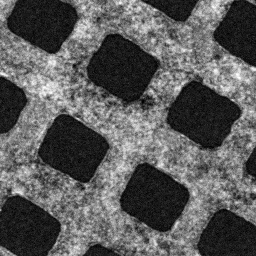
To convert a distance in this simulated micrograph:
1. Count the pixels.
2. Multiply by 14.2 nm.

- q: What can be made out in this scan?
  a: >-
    raised bodies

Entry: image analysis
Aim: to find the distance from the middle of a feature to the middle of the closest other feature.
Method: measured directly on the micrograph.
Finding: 1340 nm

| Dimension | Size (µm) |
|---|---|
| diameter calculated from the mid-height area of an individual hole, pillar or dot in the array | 0.929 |